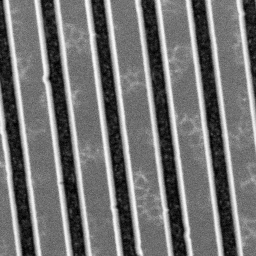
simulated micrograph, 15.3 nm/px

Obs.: parallel lines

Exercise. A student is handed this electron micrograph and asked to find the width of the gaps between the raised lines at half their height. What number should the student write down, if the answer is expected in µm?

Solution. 0.269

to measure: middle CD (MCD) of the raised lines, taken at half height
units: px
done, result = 32.4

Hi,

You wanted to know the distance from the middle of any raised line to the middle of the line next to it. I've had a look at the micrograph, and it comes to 50.1 px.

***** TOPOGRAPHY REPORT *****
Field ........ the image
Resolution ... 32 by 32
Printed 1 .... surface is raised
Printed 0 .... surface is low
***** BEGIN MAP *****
01111001111001111000111100111100
01111001111000111000111100111100
01111001111000111100111100111100
01111001111000111100111100111100
01111000111100111100111100111110
01111000111100111100111100011110
00111100111100111100111110011110
00111100111100111100011110011110
00111100111100111100011110011110
00111100111100011110011110011110
00111100111100011110011110011110
00111100011100011110011110011110
00111100011110011110011110001111
00111100011110011110011110001111
00011110011110011110011111001111
00011110011110011110001111001111
00011110011110011110001111001111
10011110011110001111001111001111
10011110011110001111001111001111
10011110001110001111001111001111
10011110001111001111001111000111
10011110001111001111001111000111
10001111001111001111001111100111
10001111001111001111000111100111
11001111001111001111000111100111
11001111001111000111100111100111
11001111001111000111100111100111
11001111000111000111100111100111
11001111000111100111100111100011
11001111000111100111100111100011
11000111100111100111100011110011
11000111100111100111100011110011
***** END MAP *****